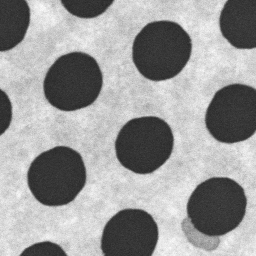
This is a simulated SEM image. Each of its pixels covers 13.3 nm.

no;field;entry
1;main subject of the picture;holes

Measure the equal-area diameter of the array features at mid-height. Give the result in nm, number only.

788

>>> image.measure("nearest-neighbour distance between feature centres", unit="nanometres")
1250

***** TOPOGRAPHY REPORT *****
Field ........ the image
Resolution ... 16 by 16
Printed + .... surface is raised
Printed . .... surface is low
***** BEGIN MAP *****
..++...+++++++..
..+++++++..+++..
.+++++++....++..
++++..++....++++
+++...+++..+++++
+++...++++++++..
.++...+++++++...
.+++++++..+++...
+++++++....++...
+++..++....+++++
++...+++..++++++
++...++++++++..+
++..++++++++...+
+++++++..+++...+
++++++....+++.++
++..++....++++++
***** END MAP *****